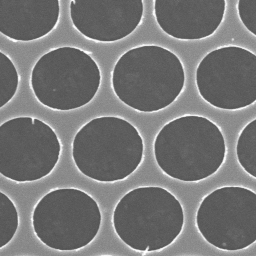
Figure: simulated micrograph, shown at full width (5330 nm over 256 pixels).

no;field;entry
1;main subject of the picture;holes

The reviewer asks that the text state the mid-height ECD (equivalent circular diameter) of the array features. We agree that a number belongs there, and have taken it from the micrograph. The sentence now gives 1400 nanometres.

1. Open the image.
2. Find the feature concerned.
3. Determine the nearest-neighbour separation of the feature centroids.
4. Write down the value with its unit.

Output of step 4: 1690 nm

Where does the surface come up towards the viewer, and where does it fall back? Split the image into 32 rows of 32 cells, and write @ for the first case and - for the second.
-------@@---------@---------@@--
-------@@---------@---------@@--
-------@@---------@@--------@@--
-------@@@-------@@@-------@@@@-
@----@@@@@@-----@@@@@-----@@@@@@
@@@@@@@@@@@@@@@@@@@@@@@@@@@@@@@@
@@@@@@----@@@@@@-----@@@@@-----@
-@@@@-------@@@-------@@@-------
--@@--------@@---------@@-------
--@@---------@---------@--------
--@@--------@@---------@@-------
--@@--------@@---------@@-------
-@@@@------@@@@-------@@@@------
@@@@@@----@@@@@@@---@@@@@@@@--@@
@@@@@@@@@@@@@@@@@@@@@@@@@@@@@@@@
------@@@@@-----@@@@@------@@@@-
-------@@@-------@@@--------@@--
-------@@---------@---------@@--
-------@@---------@---------@@--
-------@@---------@---------@@--
-------@@--------@@@--------@@--
------@@@@-------@@@@------@@@@-
@@--@@@@@@@@---@@@@@@@@--@@@@@@@
@@@@@@@@-@@@@@@@@---@@@@@@@@--@@
-@@@@@-----@@@@@------@@@@------
--@@@-------@@@-------@@@-------
--@@--------@@---------@@-------
--@@---------@---------@@-------
--@@--------@@---------@@-------
--@@@-------@@@-------@@@-------
-@@@@@-----@@@@@-----@@@@@-----@
@@@@@@@@@@@@@@@@@@@@@@@@@@@@@@@@